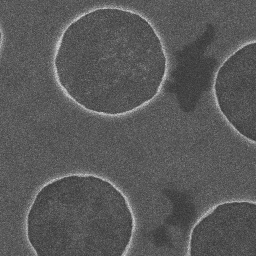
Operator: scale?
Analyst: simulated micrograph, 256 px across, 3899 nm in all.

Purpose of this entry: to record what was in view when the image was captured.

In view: holes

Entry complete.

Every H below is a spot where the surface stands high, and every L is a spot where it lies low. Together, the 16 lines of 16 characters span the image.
HHHHHHHHHHHHHHHH
HHHHHLLLLHHHHHHH
HHHHLLLLLLHHHHHH
HHHHLLLLLLHHHHLL
HHHHLLLLLLHHHHLL
HHHHLLLLLLHHHLLL
HHHHHLLLLHHHHHLL
HHHHHHHHHHHHHHLL
HHHHHHHHHHHHHHHL
HHHHHHHHHHHHHHHH
HHHHHHHHHHHHHHHH
HHHLLLLHHHHHHHHH
HHLLLLLLHHHHHHHH
HHLLLLLLHHHHHLLL
HHLLLLLLHHHHLLLL
HHLLLLLLHHHHLLLL